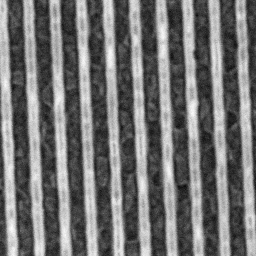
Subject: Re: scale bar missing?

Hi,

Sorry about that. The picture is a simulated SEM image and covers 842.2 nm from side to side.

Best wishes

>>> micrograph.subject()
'parallel lines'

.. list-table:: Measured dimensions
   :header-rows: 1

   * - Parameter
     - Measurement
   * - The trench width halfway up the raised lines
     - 58.7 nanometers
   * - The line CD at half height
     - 27.9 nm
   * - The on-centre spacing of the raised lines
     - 87.1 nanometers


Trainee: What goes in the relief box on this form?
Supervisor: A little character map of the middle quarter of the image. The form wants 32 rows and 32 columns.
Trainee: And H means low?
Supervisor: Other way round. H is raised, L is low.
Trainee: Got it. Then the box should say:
LLLLHHLLLLLHHLLLLHHLLLLLHHLLLLLH
LLLLHHLLLLLHHLLLLHHHLLLLHHLLLLLH
LLLLHHLLLLLHHLLLLHHLLLLLHHLLLLLH
LLLLHHLLLLLHHLLLLHHLLLLLHHLLLLLH
LLLLHHLLLLLHHLLLLLHHLLLLHHLLLLLH
LLLLHHLLLLLHHLLLLLHHLLLLHHLLLLLH
LLLLHHLLLLLHHLLLLLHHLLLLHHLLLLLH
LLLLHHLLLLLHHLLLLLHHLLLLHHLLLLLH
LLLLHHLLLLLHHLLLLLHHLLLLHHLLLLLH
LLLLHHLLLLLHHLLLLLHHLLLLHHLLLLLH
LLLLHHLLLLLHHLLLLLHHLLLLHHLLLLLH
LLLLHHLLLLLHHLLLLLHHLLLLLHHLLLLH
LLLLLHHLLLLHHLLLLLHHLLLLHHLLLLLH
LLLLHHHLLLLHHLLLLLHHLLLLHHHLLLLH
LLLLLHHLLLLHHLLLLLHHLLLLHHHLLLLH
LLLLLHHLLLLHHLLLLLHHLLLLHHHLLLLH
LLLLLHHLLLLHHLLLLLHHLLLLLHHLLLLH
LLLLLHHLLLLLHLLLLLHHLLLLLHHLLLLH
LLLLLHHLLLLHHLLLLLHHLLLLLHHLLLLL
LLLLLHHLLLLLHLLLLLHHLLLLLHHLLLLH
LLLLLHHLLLLLHLLLLLHHLLLLLHHLLLLH
LLLLLHHLLLLLHHLLLLHHLLLLLHHLLLLL
LLLLLHHLLLLLHHLLLLHHLLLLLHHLLLLL
LLLLLHHLLLLLHHLLLLHHLLLLLHHLLLLH
LLLLLHHLLLLLHHLLLLHHLLLLLHHLLLLH
LLLLLHHLLLLLHHLLLLHHLLLLLHHLLLLL
HLLLLHHLLLLLHHLLLLHHLLLLLHHLLLLL
HLLLLHHLLLLLHHLLLLHHHLLLLHHLLLLL
HLLLLHHLLLLLHHLLLLHHHLLLLHHLLLLL
HLLLLHHLLLLLHHLLLLLHHLLLLHHLLLLL
HLLLLHHLLLLLHHLLLLLHHLLLLHHLLLLL
HLLLLHHLLLLLHHLLLLLHHLLLLHHLLLLL